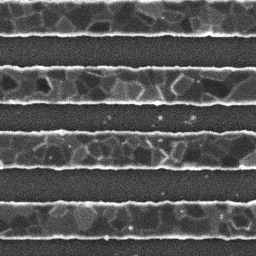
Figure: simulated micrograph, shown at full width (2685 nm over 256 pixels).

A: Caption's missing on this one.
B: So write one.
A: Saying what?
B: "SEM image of lines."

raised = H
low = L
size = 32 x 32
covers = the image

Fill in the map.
HHHHHHHHHHHHHHHHHHHHHHHHHHHHHHHH
HHHHHHHHHHHHHHHHHHHHHHHHHHHHHHHH
HHHHHHHHHHHHHHHHHHHHHHHHHHHHHHHH
HHHHHHHHHHHHHHHHHHHHHHHHHHHHHHHH
HHHHLLLHHLLLHLLLLLHLLLLHHHLHHHHH
LLLLLLLLLLLLLLLLLLLLLLLLLLLLLLLL
LLLLLLLLLLLLLLLLLLLLLLLLLLLLLLLL
LLLLLLLLLLLLLLLLLLLLLLLLLLLLLLLL
HHHHHHHHHHHHHHHHLLHHHHHHHHHLHLLH
HHHHHHHHHHHHHHHHHHHHHHHHHHHHHHHH
HHHHHHHHHHHHHHHHHHHHHHHHHHHHHHHH
HHHHHHHHHHHHHHHHHHHHHHHHHHHHHHHH
HHHHHHHHHHHHHHHHHHHHHHHHHHHHHHHH
LLLLLLLLLLLLLLLLLLLLLLLLLLLLLLLL
LLLLLLLLLLLLLLLLLLLLLLLLLLLLLLLL
LLLLLLLLLLLLLLLLLLLLLLLLLLLLLLLL
HHHLLHHHHHHLHHHHHLLHLLLLLHHLHHHH
HHHHHHHHHHHHHHHHHHHHHHHHHHHHHHHH
HHHHHHHHHHHHHHHHHHHHHHHHHHHHHHHH
HHHHHHHHHHHHHHHHHHHHHHHHHHHHHHHH
HHHHHHHHHHHHHHHHHHHHHHHHHHHHHHHH
LLLLLLLLLLLLLLLLLLLLLLLLLLLLLLLL
LLLLLLLLLLLLLLLLLLLLLLLLLLLLLLLL
LLLLLLLLLLLLLLLLLLLLLLLLLLLLLLLL
LLLLLLLLLLLLLLLLLLLLLLLLLLLLLLLL
HHHHHHHHHHHHHHLHHHHHHHHHHHHHHHLH
HHHHHHHHHHHHHHHHHHHHHHHHHHHHHHHH
HHHHHHHHHHHHHHHHHHHHHHHHHHHHHHHH
HHHHHHHHHHHHHHHHHHHHHHHHHHHHHHHH
HHHHHHHHHHHHHHHHHHHHHHHHHHHHHHHH
LLLLLLLLLLLLLLLLLLLLLLLLLLLLLLLL
LLLLLLLLLLLLLLLLLLLLLLLLLLLLLLLL